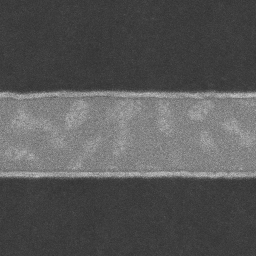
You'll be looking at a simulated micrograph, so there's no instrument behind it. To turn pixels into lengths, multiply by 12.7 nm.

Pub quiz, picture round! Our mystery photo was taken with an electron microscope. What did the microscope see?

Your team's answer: one or a few lines or trenches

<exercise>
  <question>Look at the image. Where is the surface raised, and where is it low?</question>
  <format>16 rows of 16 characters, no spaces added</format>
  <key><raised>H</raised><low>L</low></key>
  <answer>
HHHHHHHHHHHHHHHH
HHHHHHHHHHHHHHHH
HHHHHHHHHHHHHHHH
HHHHHHHHHHHHHHHH
HHHHHHHHHHHHHHHH
HHHHHHHHHHHHHHHH
LLLLLLLLLLLLLLLL
LLLLLLLLLLLLLLLL
LLLLLLLLLLLLLLLL
LLLLLLLLLLLLLLLL
LLLLLLLLLLLLLLLL
HHHHHHHHHHHHHHHH
HHHHHHHHHHHHHHHH
HHHHHHHHHHHHHHHH
HHHHHHHHHHHHHHHH
HHHHHHHHHHHHHHHH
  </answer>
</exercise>